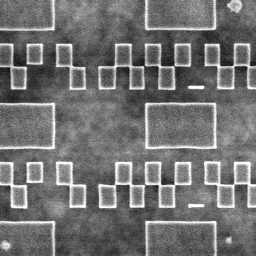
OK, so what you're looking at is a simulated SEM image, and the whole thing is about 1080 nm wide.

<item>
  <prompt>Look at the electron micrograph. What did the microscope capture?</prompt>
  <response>wiring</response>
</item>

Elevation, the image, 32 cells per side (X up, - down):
XXXXXXX-----------XXXXXXXXX--X--
XXXXXXX-----------XXXXXXXXX-----
XXXXXXX-----------XXXXXXXXX-----
XXXXXXX-----------XXXXXXXXX-----
--------------------------------
--------------------------------
XX-XX--XX-----XX--XX--XX--X--XX-
XX-XX--XX-----XX--XX--XX--X--XX-
-XX-----XX--XXX-XX--XX-----XX--X
-XX------XX-XX--XX--XX-----XX--X
-XX------XX-XX--XX--XX-----XX--X
--------------------------------
--------------------------------
XXXXXXX-----------XXXXXXXXX-----
XXXXXXX-----------XXXXXXXXX-----
XXXXXXX-----------XXXXXXXXX-----
XXXXXXX-----------XXXXXXXXX-----
XXXXXXX-----------XXXXXXXXX-----
XXXXXX-------------XXXXXXXX-----
--------------------------------
X---X--XX------X--XX--XX--X--XX-
XX-XX--XX-----XX--XX--XX--X--XX-
XX-XX--XX-----XX--XX--XX--X--XX-
-XX------XX-XX--XX--XX-----XX--X
-XX------XX-XX--XX--XX-----XX--X
-XX------XX-XX--XX--XX-----XX--X
--------------------------------
--------------------------------
XXXXXXX-----------XXXXXXXXX-----
XXXXXXX-----------XXXXXXXXX-----
XXXXXXX-----------XXXXXXXXX-----
XXXXXXX-----------XXXXXXXXX-----